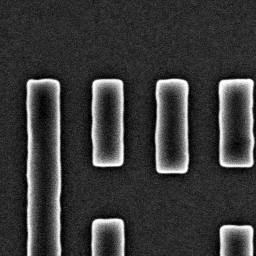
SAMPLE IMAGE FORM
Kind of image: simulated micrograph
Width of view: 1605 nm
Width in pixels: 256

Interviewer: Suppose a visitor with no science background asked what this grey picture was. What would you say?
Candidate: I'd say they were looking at wiring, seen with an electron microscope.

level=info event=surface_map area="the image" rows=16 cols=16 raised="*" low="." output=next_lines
................
................
................
................
................
..**..**..**..**
..**..**..**..**
..**..**..**..**
..**..**..**..**
..**..**..**..**
..**......**....
..**............
..**............
..**............
..**..**......**
..**..**......**